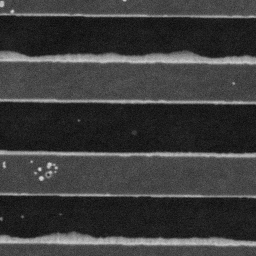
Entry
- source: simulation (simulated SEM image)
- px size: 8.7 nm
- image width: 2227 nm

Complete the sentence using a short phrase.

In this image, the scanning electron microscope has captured lines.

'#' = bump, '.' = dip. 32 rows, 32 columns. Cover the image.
################################
################################
................................
................................
................................
................................
................................
#########################.......
################################
################################
################################
################################
......##########################
................................
................................
................................
................................
................................
................................
################################
################################
################################
################################
################################
.......................#########
................................
................................
................................
................................
................................
################################
################################